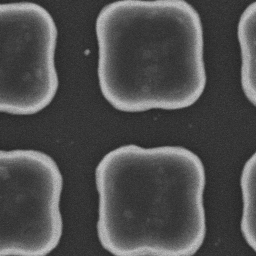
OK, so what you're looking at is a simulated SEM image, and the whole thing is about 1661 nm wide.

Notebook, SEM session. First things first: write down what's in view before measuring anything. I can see raised bodies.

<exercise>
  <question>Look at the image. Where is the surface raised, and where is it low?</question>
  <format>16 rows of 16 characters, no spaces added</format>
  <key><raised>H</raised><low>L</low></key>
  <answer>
HHLLLLLHHHHHLLLL
HHHLLLHHHHHHLLLH
HHHLLLHHHHHHHLLH
HHHLLLHHHHHHLLLH
HHHLLLHHHHHHHLLH
HHHLLLLHHHHHHLLL
HHHLLLLHHHHLLLLL
LLLLLLLLLLLLLLLL
LLLLLLLLLLLLLLLL
LLLLLLLHHHHLLLLL
HHHLLLHHHHHHLLLH
HHHHLLHHHHHHHLLH
HHHHLLHHHHHHHLLH
HHHHLLHHHHHHHLLH
HHHHLLHHHHHHHLLH
HHHLLLLHHHHHLLLL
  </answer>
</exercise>